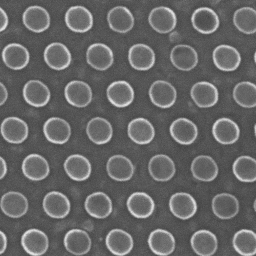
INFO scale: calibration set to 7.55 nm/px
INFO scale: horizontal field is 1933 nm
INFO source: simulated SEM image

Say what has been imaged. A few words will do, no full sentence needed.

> a regular array of raised bodies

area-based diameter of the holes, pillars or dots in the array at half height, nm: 196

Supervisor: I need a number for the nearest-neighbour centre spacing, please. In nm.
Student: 318